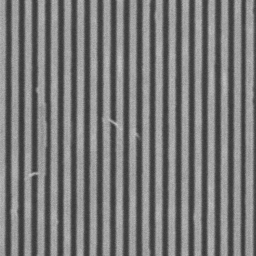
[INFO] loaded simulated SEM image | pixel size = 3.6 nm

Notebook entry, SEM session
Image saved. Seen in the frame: parallel lines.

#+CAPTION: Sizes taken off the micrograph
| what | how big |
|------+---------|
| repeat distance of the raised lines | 46.9 nm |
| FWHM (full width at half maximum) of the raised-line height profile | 20.7 nanometers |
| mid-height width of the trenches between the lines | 27 nm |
